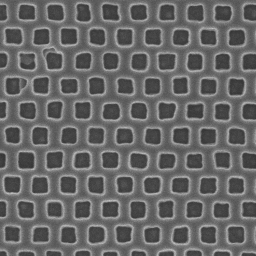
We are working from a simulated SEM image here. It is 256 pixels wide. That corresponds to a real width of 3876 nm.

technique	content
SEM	a regular array of holes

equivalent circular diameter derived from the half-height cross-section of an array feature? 0.268 µm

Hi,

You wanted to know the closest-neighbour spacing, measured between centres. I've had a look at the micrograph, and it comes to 414 nm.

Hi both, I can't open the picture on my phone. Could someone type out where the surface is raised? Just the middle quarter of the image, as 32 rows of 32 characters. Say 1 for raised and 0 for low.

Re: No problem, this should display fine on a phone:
11100001110000111000011100001110
11110011111111111100111101111110
11111111111111111111111111111111
01111110011111111111111111110011
00011100001110000111000011100001
00001100001110000111000011100001
00001100001110000111000011100001
01111110111111100111000111110011
11111111111111111111111111111111
11100011111111111111111111111111
11100001110000111000011100001110
11100001110000111000011100001100
11100001110000111000011100001100
11100011110000111000111100011110
11111111111111111111111111111111
11111111111111111111111111111111
00011100001110000111100011110001
00011100001110000111000011100001
00011100001110000111000011100001
00011100001110000111000011100001
11111111111111111111111111111111
11111111111111111111111111111111
11100011110000111000111100011110
11000001100000110000011100001100
11000001110000110000011100001100
11000001110000110000011100011110
11111111111111111111111111111111
11111111111111111111111111111111
00011100001111000111100011110001
00011100001110000111000011100001
00011100001110000111000011100001
00011100001110000111000011100001